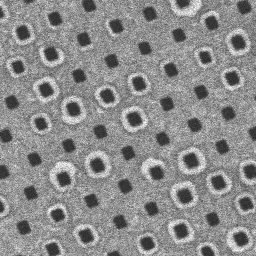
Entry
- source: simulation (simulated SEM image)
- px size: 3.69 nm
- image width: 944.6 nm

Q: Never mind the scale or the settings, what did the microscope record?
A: a regular array of holes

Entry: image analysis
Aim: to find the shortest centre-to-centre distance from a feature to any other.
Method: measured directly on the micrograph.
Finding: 126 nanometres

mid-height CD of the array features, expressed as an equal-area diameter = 0.0497 micrometres